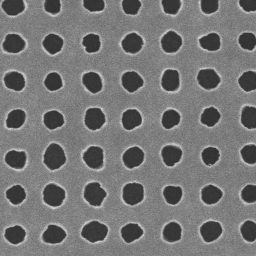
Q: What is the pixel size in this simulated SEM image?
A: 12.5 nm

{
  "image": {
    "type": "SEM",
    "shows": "a regular array of holes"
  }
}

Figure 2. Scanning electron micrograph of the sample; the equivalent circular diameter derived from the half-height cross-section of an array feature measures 20.4 pixels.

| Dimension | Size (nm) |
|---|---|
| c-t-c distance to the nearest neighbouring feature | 465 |